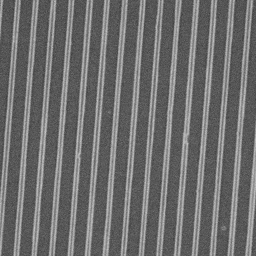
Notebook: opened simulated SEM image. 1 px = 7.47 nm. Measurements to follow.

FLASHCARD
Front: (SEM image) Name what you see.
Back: parallel lines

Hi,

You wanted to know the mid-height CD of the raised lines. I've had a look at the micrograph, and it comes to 28.9 nanometres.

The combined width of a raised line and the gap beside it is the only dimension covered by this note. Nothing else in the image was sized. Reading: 133 nm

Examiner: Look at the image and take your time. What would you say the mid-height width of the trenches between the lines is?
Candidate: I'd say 107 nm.